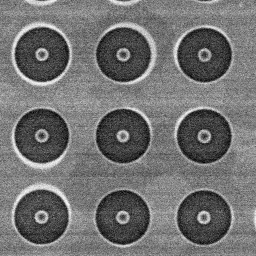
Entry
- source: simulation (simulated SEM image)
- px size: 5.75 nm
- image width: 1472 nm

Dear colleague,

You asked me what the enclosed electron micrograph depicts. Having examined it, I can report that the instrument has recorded an array of small figures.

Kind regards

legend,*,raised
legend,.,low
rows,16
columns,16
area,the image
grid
****************
****************
*...**...**...**
*...**....*...**
*...**...**...**
****************
****************
*...**...**...**
*...**...**...**
*...**...**...**
****************
****************
*...**...**...**
*...**...**...**
*...**...**...**
****************